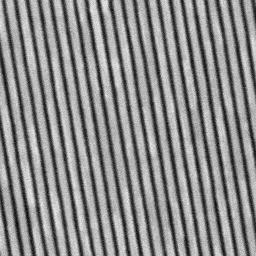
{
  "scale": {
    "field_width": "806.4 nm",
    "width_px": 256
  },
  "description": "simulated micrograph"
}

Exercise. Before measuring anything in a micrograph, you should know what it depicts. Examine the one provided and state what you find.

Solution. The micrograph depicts parallel lines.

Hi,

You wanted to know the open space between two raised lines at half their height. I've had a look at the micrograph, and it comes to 16.3 nm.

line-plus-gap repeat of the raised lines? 0.0369 um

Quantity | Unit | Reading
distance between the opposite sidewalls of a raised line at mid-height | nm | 21.3